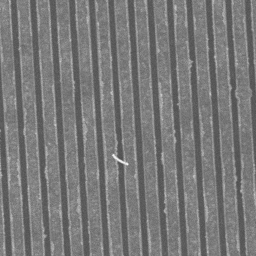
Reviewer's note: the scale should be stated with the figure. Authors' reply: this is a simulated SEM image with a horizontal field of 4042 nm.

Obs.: parallel lines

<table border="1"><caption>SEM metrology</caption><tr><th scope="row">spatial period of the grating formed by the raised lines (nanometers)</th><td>308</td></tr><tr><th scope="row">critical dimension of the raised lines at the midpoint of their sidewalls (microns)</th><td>0.199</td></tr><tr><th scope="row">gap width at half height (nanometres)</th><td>106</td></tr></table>